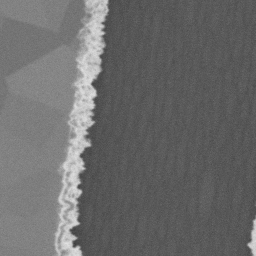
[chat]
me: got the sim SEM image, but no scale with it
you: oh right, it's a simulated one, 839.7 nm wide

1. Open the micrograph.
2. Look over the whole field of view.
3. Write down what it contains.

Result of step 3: one or a few lines or trenches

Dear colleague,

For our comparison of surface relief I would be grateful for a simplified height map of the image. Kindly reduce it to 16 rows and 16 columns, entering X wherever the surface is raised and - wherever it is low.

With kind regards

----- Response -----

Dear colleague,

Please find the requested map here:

XXXXXX----------
XXXXXX----------
XXXXXX----------
XXXXXX----------
XXXXXX----------
XXXXXX----------
XXXXXX----------
XXXXX-----------
XXXXX-----------
XXXXX-----------
XXXXX-----------
XXXXX-----------
XXXXX-----------
XXXXX-----------
XXXX------------
XXXX------------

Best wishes